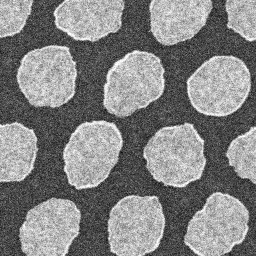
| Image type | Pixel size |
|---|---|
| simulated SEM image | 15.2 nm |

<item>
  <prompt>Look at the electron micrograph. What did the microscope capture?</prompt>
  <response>raised bodies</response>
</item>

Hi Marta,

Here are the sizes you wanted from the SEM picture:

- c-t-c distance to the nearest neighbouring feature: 83.8 pixels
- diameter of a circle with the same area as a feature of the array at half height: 907 nanometers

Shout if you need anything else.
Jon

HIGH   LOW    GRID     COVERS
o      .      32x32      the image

oooo....ooooooo....ooooooo..oooo
oooo...oooooooo....ooooooo...ooo
ooo....oooooooo....ooooooo...ooo
ooo.....ooooooo....oooooo....ooo
.........oooo......ooooo......oo
....................oo..........
....ooooo.......................
...oooooo......ooooo......oooo..
...oooooo.....oooooo.....oooooo.
..ooooooo.....oooooo....ooooooo.
..ooooooo....ooooooo....ooooooo.
...oooooo....ooooooo....ooooooo.
....oooo.....oooooo.....oooooo..
.............oo..........ooooo..
................................
...........oo...................
oooo.....oooooo.....oooo.......o
oooo.....oooooo....oooooo....ooo
ooooo...ooooooo...ooooooo....ooo
oooo....ooooooo...ooooooo....ooo
oooo....oooooo....oooooooo...ooo
oooo....oooooo.....oooooo.....oo
oo.......oooo.......oooo.......o
................................
..........................oo....
.....oooo......ooooo......oooo..
....oooooo....oooooo.....oooooo.
...ooooooo....oooooo....ooooooo.
...ooooooo....oooooo....ooooooo.
..ooooooo.....oooooo...ooooooo..
...oooooo.....oooooo....ooooo...
...ooooo......ooooo......ooo....